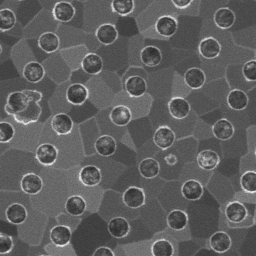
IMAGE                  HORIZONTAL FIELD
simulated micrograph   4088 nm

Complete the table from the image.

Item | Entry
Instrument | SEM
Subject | a regular array of holes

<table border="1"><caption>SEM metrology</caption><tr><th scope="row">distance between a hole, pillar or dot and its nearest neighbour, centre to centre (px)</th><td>33.4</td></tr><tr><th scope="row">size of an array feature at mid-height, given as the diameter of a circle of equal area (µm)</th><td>0.311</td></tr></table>